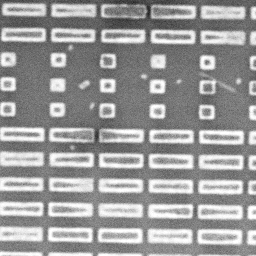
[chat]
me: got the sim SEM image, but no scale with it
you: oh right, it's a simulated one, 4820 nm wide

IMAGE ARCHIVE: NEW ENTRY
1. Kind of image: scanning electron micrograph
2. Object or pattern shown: wiring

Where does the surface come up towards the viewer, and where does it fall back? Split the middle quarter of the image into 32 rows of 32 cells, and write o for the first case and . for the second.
..........oo....................
................................
................................
................................
..........oo...........o........
....o.....oo..........ooo.......
...........o..........ooo.......
................................
................................
................................
.........ooo....................
.........ooo..........ooo.......
.........ooo..........ooo.......
................................
................................
................................
ooooooo..oo.....................
ooooooo..oooooooooo...oooooooooo
ooooooo..oooooooooo...oooooooooo
................................
................................
................................
................................
ooooooo..oooooooooo...ooooooooo.
ooooooo..oooooooooo...oooooooooo
.......................oooooooo.
................................
................................
................................
oooooo....oooooooo..............
ooooooo..oooooooooo...oooooooooo
...........oooooooo...oooooooooo